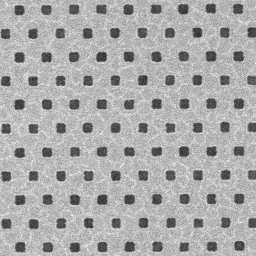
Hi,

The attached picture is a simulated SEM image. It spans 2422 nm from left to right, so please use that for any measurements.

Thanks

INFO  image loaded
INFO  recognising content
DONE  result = a regular array of holes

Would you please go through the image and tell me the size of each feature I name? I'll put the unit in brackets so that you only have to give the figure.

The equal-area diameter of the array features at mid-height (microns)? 0.109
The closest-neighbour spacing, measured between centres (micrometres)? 0.255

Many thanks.